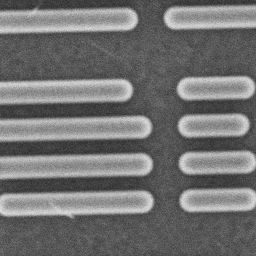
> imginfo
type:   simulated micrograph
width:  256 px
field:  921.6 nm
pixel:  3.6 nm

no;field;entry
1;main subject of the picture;groups of lines, slits or small figures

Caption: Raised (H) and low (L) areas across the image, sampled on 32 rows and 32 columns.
LLLLLLLLLLLLLLLLLLLLLLLLLLLLLLLL
LHHHHHHHHHHHHHHHHLLLLHHHHHHHHHHH
HHHHHHHHHHHHHHHHHLLLLHHHHHHHHHHH
HHHHHHHHHHHHHHHHLLLLLLHLLLLLLLLL
LLLLLLLLLLLLLLLLLLLLLLLLLLLLLLLL
LLLLLLLLLLLLLLLLLLLLLLLLLLLLLLLL
LLLLLLLLLLLLLLLLLLLLLLLLLLLLLLLL
LLLLLLLLLLLLLLLLLLLLLLLLLLLLLLLL
LLLLLLLLLLLLLLLLLLLLLLLLLLLLLLLL
LLLLLLLLLLLLLLLLLLLLLLLLLLLLLLLL
HHHHHHHHHHHHHHHHLLLLLLHHHHHHHHHH
HHHHHHHHHHHHHHHHLLLLLLHHHHHHHHHH
HHHHHHHHHHHHHHHHLLLLLLLLLLLLLLLL
LLLLLLLLLLLLLLLLLLLLLLLLLLLLLLLL
LLLLLLLLLLLLLLLLLLLLLLLLHHHHHHLL
HHHHHHHHHHHHHHHHHHHLLLHHHHHHHHHL
HHHHHHHHHHHHHHHHHHHLLLLHHHHHHHHL
HHHHHLLLLLLLLLLLLLLLLLLLLLLLLLLL
LLLLLLLLLLLLLLLLLLLLLLLLLLLLLLLL
LLLLLLLLLLHHHHHHHHLLLLLHHHHHHHHH
HHHHHHHHHHHHHHHHHHHLLLLHHHHHHHHH
HHHHHHHHHHHHHHHHHHLLLLLHHHHHHHHL
LLLLLLLLLLLLLLLLLLLLLLLLLLLLLLLL
LLLLLLLLLLLLLLLLLLLLLLLLLLLLLLLL
HHHHHHHHHHHHHHHHHHHLLLLHHHHHHHHH
HHHHHHHHHHHHHHHHHHHLLLLHHHHHHHHH
HHHHHHHHHHHHHHHHHHLLLLLLLLLLLLLL
LLLLLLLLLLLLLLLLLLLLLLLLLLLLLLLL
LLLLLLLLLLLLLLLLLLLLLLLLLLLLLLLL
LLLLLLLLLLLLLLLLLLLLLLLLLLLLLLLL
LLLLLLLLLLLLLLLLLLLLLLLLLLLLLLLL
LLLLLLLLLLLLLLLLLLLLLLLLLLLLLLLL